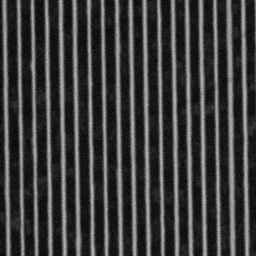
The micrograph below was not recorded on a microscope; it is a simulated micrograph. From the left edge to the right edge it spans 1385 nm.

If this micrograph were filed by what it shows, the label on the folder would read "parallel lines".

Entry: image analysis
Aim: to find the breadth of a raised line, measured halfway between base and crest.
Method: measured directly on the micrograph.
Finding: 18.3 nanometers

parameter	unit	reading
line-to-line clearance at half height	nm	60.9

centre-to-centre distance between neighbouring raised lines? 76 nm